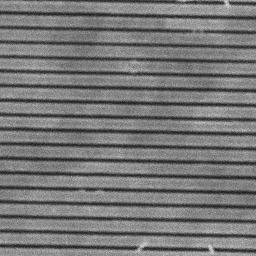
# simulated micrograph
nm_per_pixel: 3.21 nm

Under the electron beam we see parallel lines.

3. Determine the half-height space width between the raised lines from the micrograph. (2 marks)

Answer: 12.8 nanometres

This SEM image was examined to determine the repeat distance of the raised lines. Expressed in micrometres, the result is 0.0467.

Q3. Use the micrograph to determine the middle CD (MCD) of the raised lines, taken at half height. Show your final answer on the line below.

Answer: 0.0317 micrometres